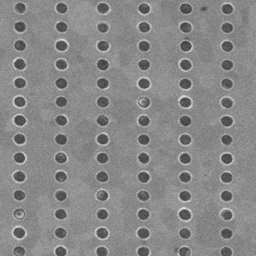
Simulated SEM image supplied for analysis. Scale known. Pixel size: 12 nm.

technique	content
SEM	a regular array of holes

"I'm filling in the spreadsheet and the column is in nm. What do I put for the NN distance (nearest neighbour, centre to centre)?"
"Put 224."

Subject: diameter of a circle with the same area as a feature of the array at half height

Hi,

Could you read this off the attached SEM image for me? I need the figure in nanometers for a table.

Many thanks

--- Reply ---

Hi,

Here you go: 144